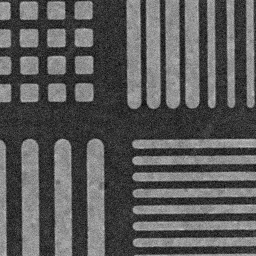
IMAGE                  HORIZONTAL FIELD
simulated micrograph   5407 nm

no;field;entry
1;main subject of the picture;groups of lines, slits or small figures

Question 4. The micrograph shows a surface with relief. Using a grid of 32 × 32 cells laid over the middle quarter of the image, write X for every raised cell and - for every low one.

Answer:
---XXXX---------XXX--XXX--XXX--X
---XXXX---------XXX--XXX--XXX--X
----------------XXX--XXX--XXX--X
----------------XXX--XXX--XXX--X
----------------XXX--XXX--XXX--X
---XXXX---------XXX--XXX--XXX--X
---XXXX---------XXX--XXX--XXX--X
---XXXX---------XXX--XXX--XXX--X
---XXXX---------XXX--XXX--XXX--X
----------------XXX--XXX--XXX--X
----------------XXX--XXX--XX---X
--------------------------------
--------------------------------
--------------------------------
--------------------------------
--------------------------------
--------------------------------
--------------------------------
--------------------------------
X-----XXX--------XXXXXXXXXXXXXXX
XX----XXXX-------XXXXXXXXXXXXXXX
XX----XXXX----------------------
XX----XXXX----------------------
XX----XXXX-------XXXXXXXXXXXXXXX
XX----XXXX-------XXXXXXXXXXXXXXX
XX----XXXX----------------------
XX----XXXX----------------------
XX----XXXX--------XXXXXXXXXXXXXX
XX----XXXX-------XXXXXXXXXXXXXXX
XX----XXXX----------------------
XX----XXXX----------------------
XX----XXXX--------XXXXXXXXXXXXXX